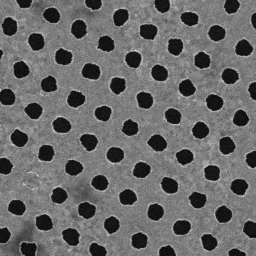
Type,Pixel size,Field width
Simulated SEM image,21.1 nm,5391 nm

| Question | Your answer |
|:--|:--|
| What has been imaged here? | a regular array of holes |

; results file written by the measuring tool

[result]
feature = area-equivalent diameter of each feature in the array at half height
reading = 0.359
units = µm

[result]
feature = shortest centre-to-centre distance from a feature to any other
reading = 642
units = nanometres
